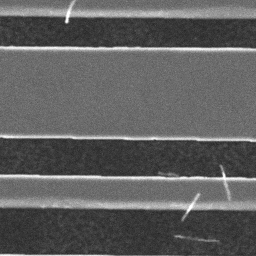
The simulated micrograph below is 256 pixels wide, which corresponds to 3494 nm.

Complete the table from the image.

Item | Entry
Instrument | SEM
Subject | lines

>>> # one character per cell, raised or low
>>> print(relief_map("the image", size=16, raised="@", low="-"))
@@@@@@@@@@@@@@@@
----------------
----------------
@@@@@@@@@@@@@@@@
@@@@@@@@@@@@@@@@
@@@@@@@@@@@@@@@@
@@@@@@@@@@@@@@@@
@@@@@@@@@@@@@@@@
@@@@@@@@@@@@@@@@
----------------
----------------
@@@@@@@@@@@@@@@@
@@@@@@@@@@@@@@@@
----------------
----------------
----------------